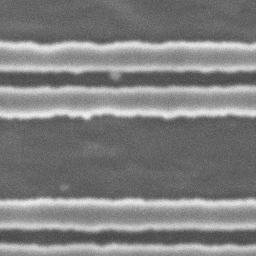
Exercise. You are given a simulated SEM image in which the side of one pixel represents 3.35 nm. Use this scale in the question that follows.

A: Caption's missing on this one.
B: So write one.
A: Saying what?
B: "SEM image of lines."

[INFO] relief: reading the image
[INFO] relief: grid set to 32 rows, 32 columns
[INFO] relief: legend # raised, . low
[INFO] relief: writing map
................................
................................
................................
................................
................................
#.......##......##...######.#...
################################
################################
################################
................................
................................
################################
################################
################################
######....#..........#..........
................................
................................
................................
................................
................................
................................
................................
................................
................................
................................
################################
################################
################################
...##..################..#######
................................
................................
################################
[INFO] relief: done